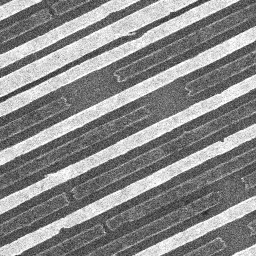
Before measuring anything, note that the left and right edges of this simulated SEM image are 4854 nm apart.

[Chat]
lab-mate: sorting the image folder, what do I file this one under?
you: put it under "parallel lines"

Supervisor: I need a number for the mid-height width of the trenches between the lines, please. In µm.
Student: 0.196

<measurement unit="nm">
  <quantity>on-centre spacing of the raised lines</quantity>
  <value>411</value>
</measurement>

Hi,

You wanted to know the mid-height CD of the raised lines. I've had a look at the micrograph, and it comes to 0.213 micrometres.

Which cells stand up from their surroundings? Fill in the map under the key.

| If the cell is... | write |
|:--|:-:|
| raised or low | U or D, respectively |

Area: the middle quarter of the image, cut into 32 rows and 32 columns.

DDDUUUUUUUDDDDDDUUUUUUDDDDDDUUUU
DUUUUUUUDDDDDUUUUUUUDDDDDDUUUUUU
UUUUUUDDDDDDDUUUUUDDDDDDUUUUUUDD
UUUUDDDDDDDDDDUUDDDDDDUUUUUUDDDD
UDDDDDDDDDDDDDDDDDDDUUUUUUDDDDDD
DDDDDDDDDDDDDDDDDDUUUUUUDDDDDDDU
DDDDDDDDDDDDDDDDUUUUUUDDDDDDDDDU
DDDDDDDDDDDDDDUUUUUUDDDDDDDDDDDU
DDDDDDDDDDDDUUUUUUDDDDDDDDDDDDDD
DDDDDDDDDDUUUUUUDDDDDDDDDDDDDDDD
UDDDDDDDUUUUUUDDDDDDDDDDDDDDDDDD
DDDDDDUUUUUUDDDDDDUUUDDDDDDDDDUU
DDDDUUUUUUDDDDDDUUUUUDDDDDDDUUUU
DDUUUUUUDDDDDDUUUUUUDDDDDDUUUUUU
UUUUUUDDDDDDUUUUUUDDDDDDUUUUUUDD
UUUUDDDDDUUUUUUUDDDDDDUUUUUUDDDD
UUDDDDDUUUUUUUDDDDDDUUUUUUUDDDDD
DDDDDUUUUUUUDDDDDDUUUUUUUDDDDDUU
DDDUUUUUUUDDDDDDUUUUUUUDDDDDUUUU
DDUUUUUUDDDDDDUUUUUUUDDDDDDUUUUU
UUUUUUDDDDDDUUUUUUUDDDDDDUUUUUUD
UUUUDDDDDDUUUUUUDDDDDDUUUUUUUDDD
UUDDDDDDUUUUUUDDDDDDUUUUUUDDDDDD
DDDDDDUUUUUUDDDDDDUUUUUUUDDDDDUU
DDDDUUUUUUDDDDDDUUUUUUUDDDDDUUUU
DDUUUUUUDDDDDDUUUUUUUDDDDDUUUUUU
UUUUUUDDDDDDUUUUUUDDDDDDUUUUUUDD
UUUUDDDDDDUUUUUUDDDDDDDUUUUUUDDD
UUDDDDDDUUUUUUDDDDDDDUUUUUUDDDDD
DDDDDDUUUUUUDDDDDDUUUUUUUDDDDDDU
DDDDUUUUUUDDDDDDUUUUUUUDDDDDDUUU
DDUUUUUUDDDDDDUUUUUUUDDDDDDUUUUU